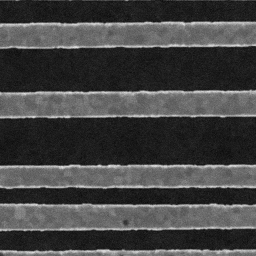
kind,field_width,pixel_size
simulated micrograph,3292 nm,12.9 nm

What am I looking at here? lines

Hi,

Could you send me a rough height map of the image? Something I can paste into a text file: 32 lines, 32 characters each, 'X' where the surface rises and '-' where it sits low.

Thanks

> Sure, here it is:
--------------------------------
--------------------------------
--------------------------------
XXXXXXXXXXXXXXXXXXXXXXXXXXXXXXXX
XXXXXXXXXXXXXXXXXXXXXXXXXXXXXXXX
XXXXXXXXXXXXXXXXXXXXXXXXXXXXXXXX
--------------------------------
--------------------------------
--------------------------------
--------------------------------
--------------------------------
----------------------X--XXX---X
XXXXXXXXXXXXXXXXXXXXXXXXXXXXXXXX
XXXXXXXXXXXXXXXXXXXXXXXXXXXXXXXX
XXXXXXXXXXXXXXX-XX-X------------
--------------------------------
--------------------------------
--------------------------------
--------------------------------
--------------------------------
--------------------------------
XXXXXXXXXXXXXXXXXXXXXXXXXXXXXXXX
XXXXXXXXXXXXXXXXXXXXXXXXXXXXXXXX
-X------------------------------
--------------------------------
--------------------------------
XXXXXXXXXXXXXXXXXXXXXXXXXXXXXXXX
XXXXXXXXXXXXXXXXXXXXXXXXXXXXXXXX
XXXXXXXXXXXXXXXXXXXXXXXX----X---
--------------------------------
--------------------------------
XXXXXXXXXXXXXXXXXXXXXXXXXXXXXXXX